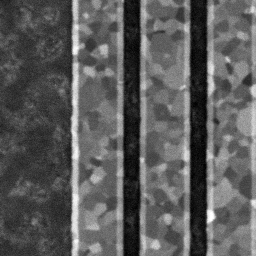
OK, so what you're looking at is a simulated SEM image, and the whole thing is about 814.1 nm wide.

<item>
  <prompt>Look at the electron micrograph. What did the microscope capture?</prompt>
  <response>one or a few lines or trenches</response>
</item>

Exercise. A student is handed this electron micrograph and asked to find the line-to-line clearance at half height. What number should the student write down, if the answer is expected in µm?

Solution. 0.0739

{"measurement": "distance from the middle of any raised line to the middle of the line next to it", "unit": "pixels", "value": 67.3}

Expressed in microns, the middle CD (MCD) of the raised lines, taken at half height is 0.142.